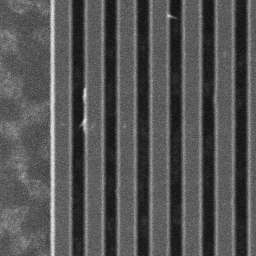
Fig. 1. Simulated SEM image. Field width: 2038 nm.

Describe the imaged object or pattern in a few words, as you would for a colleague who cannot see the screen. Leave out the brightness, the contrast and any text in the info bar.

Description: parallel lines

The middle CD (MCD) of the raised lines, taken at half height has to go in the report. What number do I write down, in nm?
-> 150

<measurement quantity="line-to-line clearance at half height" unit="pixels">13.3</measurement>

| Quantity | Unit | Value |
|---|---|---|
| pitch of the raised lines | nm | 260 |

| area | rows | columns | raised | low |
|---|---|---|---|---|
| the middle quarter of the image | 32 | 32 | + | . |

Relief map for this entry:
++...+++++...+++++....++++....++
++...+++++...+++++....++++....++
++...+++++...+++++....++++....++
++...+++++...+++++....++++....++
++...+++++...+++++....++++....++
++...+++++...+++++....++++....++
++...+++++...+++++....++++....++
++...+++++...+++++....++++....++
++...+++++...+++++....++++....++
++...+++++...+++++....++++....++
++...+++++...+++++....++++....++
++...+++++...+++++....++++....++
++...+++++...+++++....++++....++
++...+++++...+++++....++++....++
++...+++++....++++....++++....++
++...+++++...+++++....++++....++
++...+++++...+++++....++++....++
++...+++++...+++++....++++....++
++...+++++...+++++....++++....++
++...+++++...+++++....++++....++
++...+++++...+++++....++++....++
++...+++++...+++++....++++....++
++...+++++...+++++....++++....++
++...+++++...+++++....++++....++
++...+++++...+++++....++++....++
++...+++++...+++++....++++....++
++...+++++...+++++....++++....++
++...+++++...+++++....++++....++
++...+++++...+++++....++++....++
++...+++++...+++++....++++....++
++...+++++...+++++....++++....++
++...+++++...+++++....++++....++